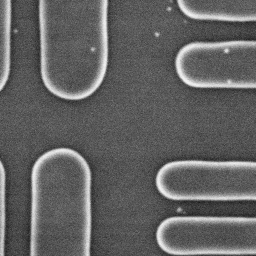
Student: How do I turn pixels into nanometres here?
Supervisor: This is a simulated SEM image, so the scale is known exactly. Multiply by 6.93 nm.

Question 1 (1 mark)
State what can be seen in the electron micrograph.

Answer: groups of lines, slits or small figures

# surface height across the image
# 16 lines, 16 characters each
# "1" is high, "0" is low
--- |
1001111000011111
1001111000000000
1001111000000000
1001111000011111
1001111000011111
0001110000000000
0000000000000000
0000000000000000
0000000000000000
0001100000000000
0011100000111111
0011110000111111
0011110000000000
0011110000000000
0011110000111111
0011110000111111